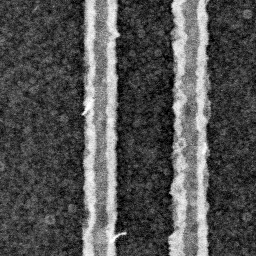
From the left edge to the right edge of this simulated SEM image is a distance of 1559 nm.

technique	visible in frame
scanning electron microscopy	one or a few lines or trenches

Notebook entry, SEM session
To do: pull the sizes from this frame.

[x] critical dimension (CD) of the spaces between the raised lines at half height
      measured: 412 nanometers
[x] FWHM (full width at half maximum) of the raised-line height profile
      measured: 0.134 µm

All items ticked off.